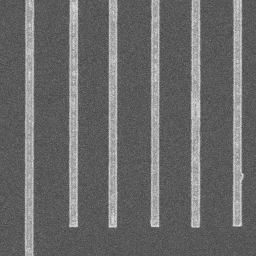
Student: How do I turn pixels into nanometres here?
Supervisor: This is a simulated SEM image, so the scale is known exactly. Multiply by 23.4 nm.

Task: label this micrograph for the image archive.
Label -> parallel lines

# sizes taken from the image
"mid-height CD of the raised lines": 172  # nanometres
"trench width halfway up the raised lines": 798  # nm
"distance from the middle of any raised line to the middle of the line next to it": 973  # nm